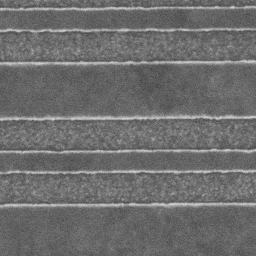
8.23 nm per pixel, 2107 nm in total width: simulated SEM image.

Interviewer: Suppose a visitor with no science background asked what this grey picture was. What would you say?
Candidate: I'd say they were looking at lines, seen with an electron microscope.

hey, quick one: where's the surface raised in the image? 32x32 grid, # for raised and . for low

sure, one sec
................................
################################
################################
################################
................................
................................
................................
................................
################################
################################
################################
################################
################################
################################
################################
................................
................................
................................
................................
################################
################################
#############################.##
................................
................................
................................
................#..#...#########
################################
################################
################################
################################
################################
################################